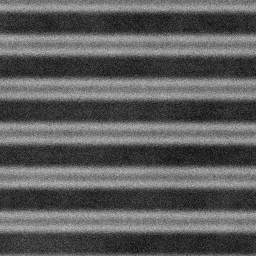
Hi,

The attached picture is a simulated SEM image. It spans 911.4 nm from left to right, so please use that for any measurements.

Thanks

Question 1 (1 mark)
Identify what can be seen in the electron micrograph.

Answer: parallel lines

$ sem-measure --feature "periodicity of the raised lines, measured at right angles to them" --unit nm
157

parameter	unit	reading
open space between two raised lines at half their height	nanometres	92.2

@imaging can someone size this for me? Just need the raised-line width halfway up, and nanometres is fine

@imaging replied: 64.1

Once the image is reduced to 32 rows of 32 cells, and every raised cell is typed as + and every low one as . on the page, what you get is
++++++++++++++++++++++++++++++++
................................
................................
................................
................................
++++++++++++++++++++++++++++++++
++++++++++++++++++++++++++++++++
................................
................................
................................
++++++++++++++++++++++++++++++++
++++++++++++++++++++++++++++++++
................................
................................
................................
................................
++++++++++++++++++++++++++++++++
++++++++++++++++++++++++++++++++
................................
................................
................................
++++++++++++++++++++++++++++++++
++++++++++++++++++++++++++++++++
................................
................................
................................
................................
++++++++++++++++++++++++++++++++
++++++++++++++++++++++++++++++++
................................
................................
................................